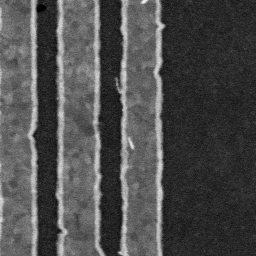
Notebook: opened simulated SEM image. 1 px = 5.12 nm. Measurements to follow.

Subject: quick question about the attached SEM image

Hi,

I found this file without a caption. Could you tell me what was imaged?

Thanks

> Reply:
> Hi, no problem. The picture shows one or a few lines or trenches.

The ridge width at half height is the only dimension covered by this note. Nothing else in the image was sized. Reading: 36 pixels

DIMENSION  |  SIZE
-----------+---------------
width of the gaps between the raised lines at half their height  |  138 nanometers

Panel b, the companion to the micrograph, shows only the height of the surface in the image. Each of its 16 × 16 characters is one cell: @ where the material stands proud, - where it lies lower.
@@--@@--@@------
@@--@@--@@------
@@--@@--@@------
@@--@@--@@------
@@--@@--@@------
@@--@@--@@------
@@--@@--@@------
@@--@@--@@------
@@--@@--@@------
@@--@@--@@------
@@--@@--@@------
@@--@@--@@------
@@--@@--@@------
@@--@@--@@------
@@--@@--@@------
@@--@@--@@------